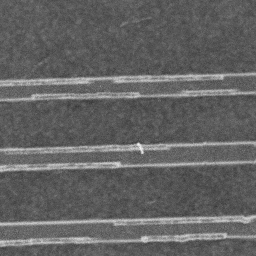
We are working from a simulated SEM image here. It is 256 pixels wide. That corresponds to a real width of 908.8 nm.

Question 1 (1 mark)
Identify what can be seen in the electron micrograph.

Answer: one or a few lines or trenches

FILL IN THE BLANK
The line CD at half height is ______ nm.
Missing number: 72.8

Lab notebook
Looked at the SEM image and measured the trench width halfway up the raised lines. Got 181 nm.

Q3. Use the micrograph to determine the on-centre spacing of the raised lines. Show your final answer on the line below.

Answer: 255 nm